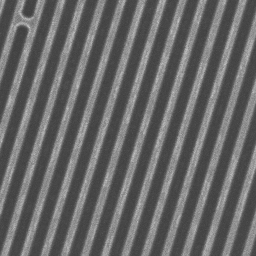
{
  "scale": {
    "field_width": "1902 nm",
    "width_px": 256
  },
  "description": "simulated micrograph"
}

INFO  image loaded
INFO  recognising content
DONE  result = parallel lines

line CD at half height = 0.0586 µm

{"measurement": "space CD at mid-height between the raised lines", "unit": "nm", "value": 85.3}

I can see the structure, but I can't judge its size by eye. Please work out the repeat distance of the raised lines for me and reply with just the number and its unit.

143 nanometers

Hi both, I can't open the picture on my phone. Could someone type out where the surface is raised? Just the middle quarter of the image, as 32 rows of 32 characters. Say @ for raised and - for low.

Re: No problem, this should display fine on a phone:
@---@----@---@@@---@@---@@---@@-
---@@---@@---@@---@@---@@---@@--
---@@---@@---@@---@@---@@---@@--
---@----@@---@@---@@---@@---@@--
--@@---@@---@@----@---@@---@@---
--@@---@@---@@---@@---@@---@@---
--@@---@@---@@---@@---@@---@@---
-@@----@---@@----@---@@@---@@---
-@@---@@---@@---@@---@@---@@---@
-@@---@@---@@---@@---@@---@@---@
-@@---@---@@----@@---@@---@@---@
@@---@@---@@---@@---@@---@@---@@
@@---@@---@@---@@---@@---@@---@@
@@---@----@@---@@---@@---@@---@@
@---@@---@@---@@---@@---@@---@@-
@---@@---@@---@@---@@---@@---@@-
@---@@---@@---@@---@@---@@---@@-
---@@---@@----@---@@---@@@---@@-
---@@---@@---@@---@@---@@---@@--
---@@---@@---@@---@@---@@---@@--
--@@---@@----@---@@@---@@---@@--
--@@---@@---@@---@@---@@---@@---
--@@---@@---@@---@@---@@---@@---
-@@---@@@---@@---@@---@@---@@---
-@@---@@---@@---@@---@@---@@---@
-@@---@@---@@---@@---@@---@@---@
@@@---@@---@@---@@---@@---@@---@
@@---@@---@@---@@---@@---@@@---@
@@---@@---@@---@@---@@---@@---@@
@@---@@---@@---@@---@@---@@---@@
@@---@---@@---@@----@@---@@---@@
@---@@---@@---@@---@@---@@---@@-